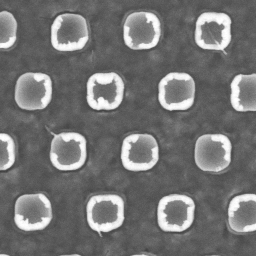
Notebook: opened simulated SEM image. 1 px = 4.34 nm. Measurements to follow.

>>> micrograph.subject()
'a regular array of raised bodies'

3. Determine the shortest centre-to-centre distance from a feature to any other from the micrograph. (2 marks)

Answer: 303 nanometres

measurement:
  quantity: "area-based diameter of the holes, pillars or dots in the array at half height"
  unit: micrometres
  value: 0.168